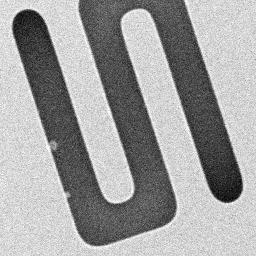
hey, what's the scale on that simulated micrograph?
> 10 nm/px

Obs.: groups of lines, slits or small figures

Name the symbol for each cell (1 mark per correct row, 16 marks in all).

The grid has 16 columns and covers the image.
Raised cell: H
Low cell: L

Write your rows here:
HHHHHLLLLLLLHHHH
HLLHHLLLHHLLHHHH
HLLHHLLLHHLLHHHH
HLLLHHLLHHLLLHHH
HHLLHHLLHHHLLHHH
HHLLHHLLLHHLLHHH
HHLLLHHLLHHLLLHH
HHHLLHHLLHHHLLHH
HHHLLHHLLLHHLLHH
HHHLLLHHLLHHLLLH
HHHLLLHHLLHHHLLH
HHHHLLHHLLLHHLLH
HHHHLLLHLLLHHHLH
HHHHLLLLLLLHHHHH
HHHHHLLLLHHHHHHH
HHHHHHHHHHHHHHHH